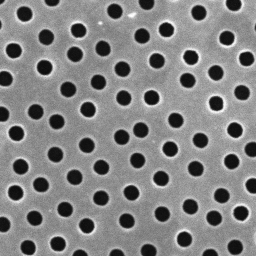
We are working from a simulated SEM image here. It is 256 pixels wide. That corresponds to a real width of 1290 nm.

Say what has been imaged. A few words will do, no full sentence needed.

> a regular array of holes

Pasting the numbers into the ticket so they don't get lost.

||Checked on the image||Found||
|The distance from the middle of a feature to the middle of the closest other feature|142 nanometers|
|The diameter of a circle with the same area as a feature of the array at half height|80.2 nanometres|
